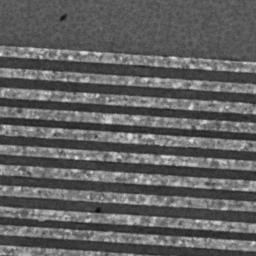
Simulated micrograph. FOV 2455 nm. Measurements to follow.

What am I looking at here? parallel lines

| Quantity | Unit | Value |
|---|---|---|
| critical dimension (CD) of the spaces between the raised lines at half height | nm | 108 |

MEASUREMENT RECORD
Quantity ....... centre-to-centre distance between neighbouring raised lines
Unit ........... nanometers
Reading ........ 190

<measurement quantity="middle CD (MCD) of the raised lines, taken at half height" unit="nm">82.5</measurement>